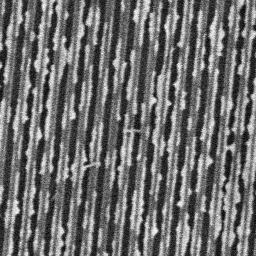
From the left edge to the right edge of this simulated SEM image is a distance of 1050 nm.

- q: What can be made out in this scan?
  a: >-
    parallel lines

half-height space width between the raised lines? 27 nm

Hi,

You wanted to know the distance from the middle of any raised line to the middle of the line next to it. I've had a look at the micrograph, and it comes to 63.9 nanometres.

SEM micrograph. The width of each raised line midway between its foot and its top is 38.2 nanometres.